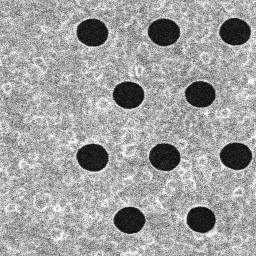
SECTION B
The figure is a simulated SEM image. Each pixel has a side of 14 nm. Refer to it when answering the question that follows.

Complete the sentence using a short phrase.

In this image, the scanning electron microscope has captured a regular array of holes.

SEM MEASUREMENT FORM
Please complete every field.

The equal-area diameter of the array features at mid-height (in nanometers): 413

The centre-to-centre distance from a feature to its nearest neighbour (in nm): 999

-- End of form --